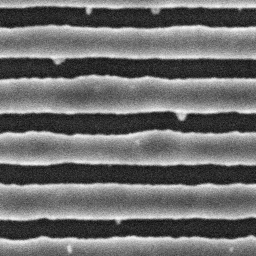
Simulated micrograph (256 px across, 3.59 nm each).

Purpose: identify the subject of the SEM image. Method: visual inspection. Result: lines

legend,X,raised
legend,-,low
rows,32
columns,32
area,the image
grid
XXXXXXXXXXXXXXXXXXXXXXXXXXXXXXXX
--------------------------------
--------------------------------
---XXXXXXXX----------XXXXX-----X
XXXXXXXXXXXXXXXXXXXXXXXXXXXXXXXX
XXXXXXXXXXXXXXXXXXXXXXXXXXXXXXXX
XXXXXXXXXXXXXXXXXXXXXXXXXXXXXXXX
--------------------------------
--------------------------------
-----------X--------------------
XXXXXXXXXXXXXXXXXXXXXXXXXXXXXXXX
XXXXXXXXXXXXXXXXXXXXXXXXXXXXXXXX
XXXXXXXXXXXXXXXXXXXXXXXXXXXXXXXX
XXXXXXXXXXXXXXXXXXXXXXXXXXXXXXXX
--------------------------------
--------------------------------
------------------XXXX----------
XXXXXXXXXXXXXXXXXXXXXXXXXXXXXXXX
XXXXXXXXXXXXXXXXXXXXXXXXXXXXXXXX
XXXXXXXXXXXXXXXXXXXXXXXXXXXXXXXX
--XXXX----------XXXXXXXXX--XXXXX
--------------------------------
--------------------------------
XXXXXXXXXXXXXXXXXXXXXXXXXXXXXXXX
XXXXXXXXXXXXXXXXXXXXXXXXXXXXXXXX
XXXXXXXXXXXXXXXXXXXXXXXXXXXXXXXX
XXXXXXXXXXXXXXXXXXXXXXXXXXXXXXXX
--------------------------------
--------------------------------
--------------------------------
XXXXXXXXXXXXXXXXXXXXXXXXXXXXXXXX
XXXXXXXXXXXXXXXXXXXXXXXXXXXXXXXX